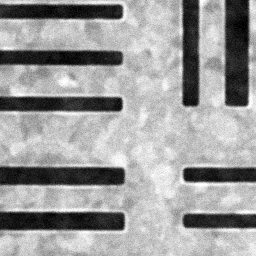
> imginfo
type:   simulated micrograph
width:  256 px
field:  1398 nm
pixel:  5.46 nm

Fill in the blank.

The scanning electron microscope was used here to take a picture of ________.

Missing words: groups of lines, slits or small figures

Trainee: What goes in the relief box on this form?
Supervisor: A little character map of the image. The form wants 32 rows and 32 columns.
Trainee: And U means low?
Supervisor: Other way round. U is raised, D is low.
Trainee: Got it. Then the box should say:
DDDDDDDDDDDDDDDUUUUUUUUDDUUUDDDU
DDDDDDDDDDDDDDDDUUUUUUUDDUUUDDDU
DDDDDDDDDDDDDDDUUUUUUUUDDUUUDDDU
UUUUUUUUUUUUUUUUUUUUUUUDDUUUDDDU
UUUUUUUUUUUUUUUUUUUUUUUDDUUUDDDU
UUUUUUUUUUUUUUUUUUUUUUUDDUUUDDDU
DDDDDDDDDDDDDDDUUUUUUUUDDUUUDDDU
DDDDDDDDDDDDDDDUUUUUUUUDDUUUDDDU
UUUUUUUUUUUUUUUUUUUUUUUDDUUUDDDU
UUUUUUUUUUUUUUUUUUUUUUUDDUUUDDDU
UUUUUUUUUUUUUUUUUUUUUUUDDUUUDDDU
UUUUUUUUUUUUUUUUUUUUUUUDDUUUDDDU
DDDDDDDDDDDDDDDUUUUUUUUDDUUUDDDU
DDDDDDDDDDDDDDDUUUUUUUUUUUUUUUUU
UUUUUUUUUUUUUUUUUUUUUUUUUUUUUUUU
UUUUUUUUUUUUUUUUUUUUUUUUUUUUUUUU
UUUUUUUUUUUUUUUUUUUUUUUUUUUUUUUU
UUUUUUUUUUUUUUUUUUUUUUUUUUUUUUUU
UUUUUUUUUUUUUUUUUUUUUUUUUUUUUUUU
UUUUUUUUUUUUUUUUUUUUUUUUUUUUUUUU
UUUUUUUUUUUUUUUUUUUUUUUUUUUUUUUU
DDDDDDDDDDDDDDDDUUUUUUUDDDDDDDDD
DDDDDDDDDDDDDDDDUUUUUUUDDDDDDDDD
UUUUUUUUUUUUUUUUUUUUUUUUUUUUUUUU
UUUUUUUUUUUUUUUUUUUUUUUUUUUUUUUU
UUUUUUUUUUUUUUUUUUUUUUUUUUUUUUUU
DDDDDDDDDDDDDDDUUUUUUUUUUUUUUUUU
DDDDDDDDDDDDDDDDUUUUUUUDDDDDDDDD
DDDDDDDDDDDDDDDDUUUUUUUDDDDDDDDD
UUUUUUUUUUUUUUUUUUUUUUUUUUUUUUUU
UUUUUUUUUUUUUUUUUUUUUUUUUUUUUUUU
UUUUUUUUUUUUUUUUUUUUUUUUUUUUUUUU